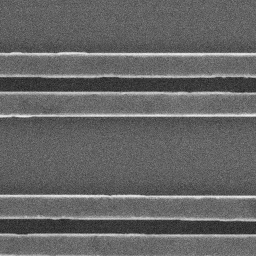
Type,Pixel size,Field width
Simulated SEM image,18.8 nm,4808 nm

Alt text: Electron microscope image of lines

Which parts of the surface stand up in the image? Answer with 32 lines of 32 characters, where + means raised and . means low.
................................
................................
................................
................................
................................
................................
................................
++++++++++++++++++++++++++++++++
++++++++++++++++++++++++++++++++
++++++++++++++++++++++++++++++++
................................
................................
++++++++++++++++++++++++++++++++
++++++++++++++++++++++++++++++++
+.++............................
................................
................................
................................
................................
................................
................................
................................
................................
................................
++++++++++++..++++..............
++++++++++++++++++++++++++++++++
++++++++++++++++++++++++++++++++
...........................++.++
................................
++++++++++++++++++++++++++++++++
++++++++++++++++++++++++++++++++
++++++++++++++++++++++++++++++++